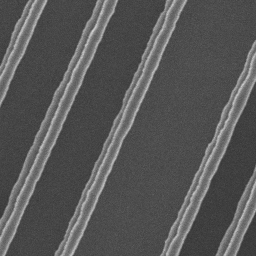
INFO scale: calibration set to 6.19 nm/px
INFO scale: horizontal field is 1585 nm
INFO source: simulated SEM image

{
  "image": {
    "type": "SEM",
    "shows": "lines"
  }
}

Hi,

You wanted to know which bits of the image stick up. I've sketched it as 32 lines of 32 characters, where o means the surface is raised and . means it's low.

...ooo......ooo......oo.........
...oo.......oo......ooo.........
..ooo......ooo......oo..........
..oo.......oo......ooo..........
.ooo......ooo......oo...........
.oo.......oo......ooo...........
.oo......ooo......oo...........o
oo.......oo.......oo...........o
oo.......oo......ooo...........o
oo......ooo......oo...........oo
o.......oo......ooo...........oo
o......ooo......oo...........oo.
.......oo......ooo...........oo.
......ooo......oo...........oo..
......oo.......oo...........oo..
.....ooo......oo...........oo...
.....oo.......oo...........oo...
....ooo......oo............oo...
....oo.......oo...........oo....
...ooo.......oo...........oo....
...ooo......oo...........oo.....
...oo.......oo...........oo.....
..ooo......oo...........oo.....o
..oo.......oo...........oo.....o
.ooo......oo...........ooo....oo
.oo.......oo...........oo.....oo
.oo......oo...........ooo.....oo
oo.......oo...........oo.....oo.
oo.......oo...........oo.....oo.
oo......oo...........oo.....oo..
o.......oo...........oo.....oo..
o......oo...........oo.....ooo..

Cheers